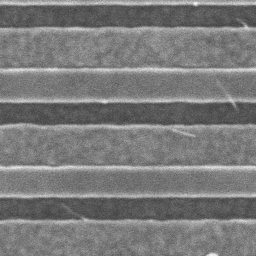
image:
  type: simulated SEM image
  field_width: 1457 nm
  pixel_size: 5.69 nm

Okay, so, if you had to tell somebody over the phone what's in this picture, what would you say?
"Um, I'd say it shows lines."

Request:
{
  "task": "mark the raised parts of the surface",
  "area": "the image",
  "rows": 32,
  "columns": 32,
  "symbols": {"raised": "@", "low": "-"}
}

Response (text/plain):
@@@@@@@@@@@@@--@@@@-@@@-@@@@@@@@
--------------------------------
--------------------------------
-----@@@-@---@@@-@@@--@@@--@@-@@
@@@@@@@@@@@@@@@@@@@@@@@@@@@@@@@@
@@@@@@@@@@@@@@@@@@@@@@@@@@@@@@@@
@@@@@@@@@@@@@@@@@@@@@@@@@@@@@@@@
@@@@@@@@@@@@@@@@@@@@@@@@@@@@@@@@
@@@@@@@@@@@@@@@@@@@@@@@@@@@@@@@@
@@@@@@@@@@@@@@@@@@@@@@@@@@@@@@@@
@@@@@@@@@@@@@@@@@@@@@@@@@@@@@@@@
@@@@@@@@@@@@@@@@@@@@@@@@@@@@@@@@
@@@@@@@@@@@@@@@@@@@@@@@@@@@@@@@@
--------------------------------
--------------------------------
--------------------------------
@@@@@@@@@@@@@@@@@@@@@@@@@@@@@@@@
@@@@@@@@@@@@@@@@@@@@@@@@@@@@@@@@
@@@@@@@@@@@@@@@@@@@@@@@@@@@@@@@@
@@@@@@@@@@@@@@@@@@@@@@@@@@@@@@@@
@@@@@@@@@@@@@@@@@@@@@@@@@@@@@@@@
@@@@@@@@@@@@@@@@@@@@@@@@@@@@@@@@
@@@@@@@@@@@@@@@@@@@@@@@@@@@@@@@@
@@@@@@@@@@@@@@@@@@@@@@@@@@@@@@@@
@@@@@@@@@@@@@@@@@@@@@@@@@@@@@@@@
--------------------------------
--------------------------------
--@-------@----@@--------@@--@@@
@@@@@@@@@@@@@@@@@@@@@@@@@@@@@@@@
@@@@@@@@@@@@@@@@@@@@@@@@@@@@@@@@
@@@@@@@@@@@@@@@@@@@@@@@@@@@@@@@@
@@@@@@@@@@@@@@@@@@@@@@@@@@@@@@@@